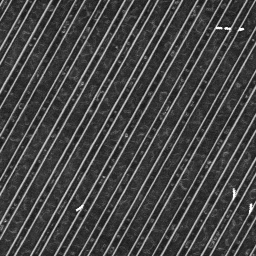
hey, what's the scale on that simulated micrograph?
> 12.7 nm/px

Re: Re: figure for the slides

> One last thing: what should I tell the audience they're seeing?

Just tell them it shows parallel lines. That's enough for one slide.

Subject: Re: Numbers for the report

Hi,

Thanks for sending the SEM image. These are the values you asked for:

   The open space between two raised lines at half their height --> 163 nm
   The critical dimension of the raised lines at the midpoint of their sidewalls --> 8.18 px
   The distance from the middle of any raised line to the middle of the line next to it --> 270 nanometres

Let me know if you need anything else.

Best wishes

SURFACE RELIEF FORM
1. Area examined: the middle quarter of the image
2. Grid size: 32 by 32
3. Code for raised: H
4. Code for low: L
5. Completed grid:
HHLLLLHHLLLLHHLLLLHHLLLLHHLLLLHH
HHLLLLHHLLLLHHLLLLHHLLLLHHLLLLHH
HLLLLHHLLLLHHLLLLHHLLLLHHLLLLHHL
LLLLHHLLLLHHHLLLHHHLLLLHHLLLLHHL
LLLLHHLLLLHHLLLLHHLLLLHHLLLLHHLL
LLLHHLLLLHHLLLLHHHLLLHHHLLLLHHLL
LLLHHLLLLHHLLLLHHLLLLHHLLLLHHLLL
LLHHLLLLHHLLLLHHLLLLHHHLLLHHHLLL
LLHHLLLLHHLLLLHHLLLLHHLLLLHHLLLL
LHHLLLLHHLLLLHHLLLLHHLLLLHHLLLLH
HHHLLLLHHLLLLHHLLLLHHLLLLHHLLLLH
HHLLLLHHLLLLHHLLLLHHLLLLHHLLLLHH
HLLLLHHHLLLHHHLLLHHHLLLLHHLLLLHH
HLLLLHHLLLLHHLLLLHHLLLLHHLLLLHHL
LLLLHHHLLLHHHLLLHHHLLLLHHLLLLHHL
LLLLHHLLLLHHLLLLHHLLLLHHLLLLHHLL
LLLHHLLLLHHLLLLHHLLLLLHHLLLLHHLL
LLLHHLLLLHHLLLLHHLLLLHHLLLLHHLLL
LLHHLLLLHHLLLLHHLLLLHHLLLLHHHLLL
LLHHLLLLHHLLLLHHLLLLHHLLLLHHLLLL
LHHLLLLHHLLLLHHLLLLHHLLLLHHHLLLH
HHHLLLHHHLLLHHHLLLLHHLLLLHHLLLLH
HHLLLLHHLLLLHHLLLLHHLLLLHHLLLLHH
HLLLLHHHLLLHHHLLLHHHLLLLHHLLLLHH
HLLLLHHLLLLHHLLLLHHLLLLHHLLLLHHL
LLLLHHLLLLHHLLLLHHHLLLLHHLLLLHHL
LLLLHHLLLLHHLLLLHHLLLLHHLLLLHHLL
LLLHHLLLLHHLLLLHHHLLLHHHLLLHHHLL
LLLHHLLLLHHLLLLHHLLLLHHLLLLHHLLL
LLHHLLLLHHLLLLHHLLLLHHHLLLHHHLLL
LHHHLLLHHHLLLHHHLLLLHHLLLLHHLLLL
LHHLLLLHHLLLLHHLLLLHHLLLLHHLLLLH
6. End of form